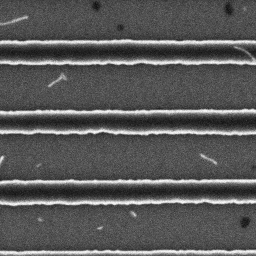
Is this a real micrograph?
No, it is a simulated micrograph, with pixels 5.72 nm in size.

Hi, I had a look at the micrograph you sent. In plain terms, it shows lines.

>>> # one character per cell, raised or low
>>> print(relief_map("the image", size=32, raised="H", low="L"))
LLLLLLLLLLLLLLLLLLLLLLLLLLLLLLLL
LLLLLLLLLLLLLLLLLLLLLLLLLLLLLLLL
LLLLLLLLLLLLLLLLLLLLLLLLLLLLLLLL
LLLLLLLLLLLLLLLLLLLLLLLLLLLLLLLL
LLLLLLLLLLLLLLLLLLLLLLLLLLLLLLLL
HHHHHHHHHHHHHHHHHHHHHHHHHHHHHHHH
HHHHHHHHHHHHHHHHHHHHHHHHHHHHHHHH
HHHHHHHHHHHHHHHHHHHHHHHHHHHHHHHH
LLLLLLLLLLLLLLLLLLLLLLLLLLLLLLLL
LLLLLLLLLLLLLLLLLLLLLLLLLLLLLLLL
LLLLLLLLLLLLLLLLLLLLLLLLLLLLLLLL
LLLLLLLLLLLLLLLLLLLLLLLLLLLLLLLL
LLLLLLLLLLLLLLLLLLLLLLLLLLLLLLLL
LLLLLLLLLLLLLLLLLLLLLLLLLLLLLLLL
HHHHHHHHHHHHHHHHHHHHHHHHHHHHHHHH
HHHHHHHHHHHHHHHHHHHHHHHHHHHHHHHH
HHHHHHHHHHHHLHHHHHHHHHHHHHHHHHHH
LLLLLLLLLLLLLLLLLLLLLLLLLLLLLLLL
LLLLLLLLLLLLLLLLLLLLLLLLLLLLLLLL
LLLLLLLLLLLLLLLLLLLLLLLLLLLLLLLL
LLLLLLLLLLLLLLLLLLLLLLLLLLLLLLLL
LLLLLLLLLLLLLLLLLLLLLLLLLLLLLLLL
LLLLLLLLLLLLLLLLLLLLLLLLLLLLLLLL
HHHHHHHHHHHHHHHHHHHHHHHHHHHHHHHH
HHHHHHHHHHHHHHHHHHHHHHHHHHHHHHHH
HHHHLHHLHHLHHHLHLHLLLLLLLLLLLLLL
LLLLLLLLLLLLLLLLLLLLLLLLLLLLLLLL
LLLLLLLLLLLLLLLLLLLLLLLLLLLLLLLL
LLLLLLLLLLLLLLLLLLLLLLLLLLLLLLLL
LLLLLLLLLLLLLLLLLLLLLLLLLLLLLLLL
LLLLLLLLLLLLLLLLLLLLLLLLLLLLLLLL
HHLHHHHHHHHHHHHHHHHHHHHHHHHHHHHH